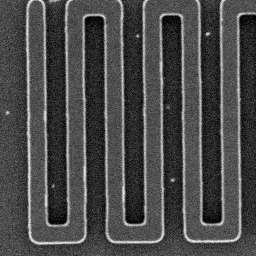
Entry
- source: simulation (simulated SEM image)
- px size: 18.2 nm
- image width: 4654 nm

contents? groups of lines, slits or small figures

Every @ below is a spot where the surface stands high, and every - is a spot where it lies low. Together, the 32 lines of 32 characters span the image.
----@---@@@@@@@---@@@@@@@---@@@@
---@@---@@@@@@@---@@@@@@@---@@@@
---@@---@@@--@@---@@---@@---@@--
---@@@--@@---@@---@@---@@---@@--
---@@@--@@---@@---@@---@@---@@--
---@@@--@@---@@---@@---@@---@@--
---@@@--@@---@@---@@---@@---@@--
----@@--@@---@@---@@---@@---@@--
----@@--@@---@@---@@---@@---@@--
----@@--@@---@@---@@---@@---@@--
----@@--@@---@@---@@---@@---@@--
----@@--@@---@@---@@---@@---@@--
----@@--@@@--@@---@@---@@---@@--
----@@--@@@--@@---@@---@@---@@--
----@@--@@@--@@---@@---@@---@@--
----@@---@@--@@---@@---@@---@@--
----@@---@@--@@---@@---@@---@@--
----@@---@@--@@---@@---@@---@@--
----@@---@@--@@---@@---@@---@@--
----@@---@@--@@---@@---@@---@@--
----@@---@@--@@---@@---@@---@@--
----@@---@@--@@---@@---@@---@@--
----@@---@@--@@---@@---@@---@@--
----@@---@@--@@---@@---@@---@@--
----@@---@@--@@---@@---@@---@@--
----@@---@@--@@---@@---@@---@@--
----@@---@@--@@@--@@---@@---@@--
----@@--@@@--@@@--@@---@@---@@--
----@@@@@@@--@@@@@@@---@@@@@@@--
----@@@@@@@--@@@@@@@---@@@@@@@--
--------------------------------
--------------------------------